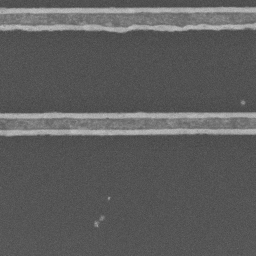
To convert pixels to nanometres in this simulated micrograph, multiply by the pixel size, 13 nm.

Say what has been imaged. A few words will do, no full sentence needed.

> one or a few lines or trenches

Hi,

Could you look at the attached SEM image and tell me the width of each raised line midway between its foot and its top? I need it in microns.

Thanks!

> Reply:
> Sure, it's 0.206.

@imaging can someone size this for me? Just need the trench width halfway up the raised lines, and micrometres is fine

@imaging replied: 1.15